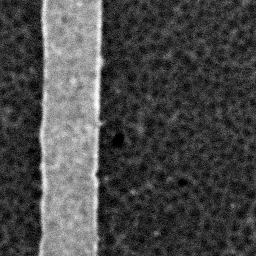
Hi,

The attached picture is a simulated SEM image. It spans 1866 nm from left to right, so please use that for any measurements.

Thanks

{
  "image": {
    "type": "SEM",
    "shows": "one or a few lines or trenches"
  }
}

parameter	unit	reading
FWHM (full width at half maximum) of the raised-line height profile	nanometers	398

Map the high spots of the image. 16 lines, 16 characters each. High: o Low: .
...ooo..........
...ooo..........
...ooo..........
...ooo..........
...ooo..........
...ooo..........
...ooo..........
...ooo..........
...ooo..........
...ooo..........
...ooo..........
...ooo..........
...ooo..........
...ooo..........
...ooo..........
...ooo..........